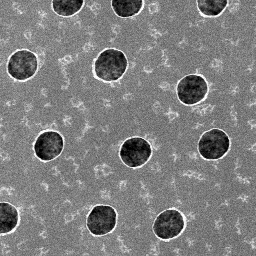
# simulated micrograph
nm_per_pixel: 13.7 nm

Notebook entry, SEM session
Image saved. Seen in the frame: a regular array of holes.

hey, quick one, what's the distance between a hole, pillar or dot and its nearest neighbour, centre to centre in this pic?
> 980 nanometres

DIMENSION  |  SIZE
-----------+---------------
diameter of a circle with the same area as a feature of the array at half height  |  414 nm